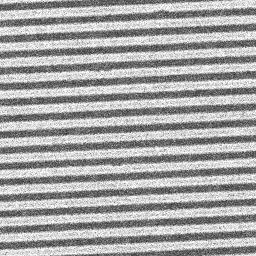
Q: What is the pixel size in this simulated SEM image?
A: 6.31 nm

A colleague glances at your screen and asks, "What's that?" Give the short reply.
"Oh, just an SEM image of parallel lines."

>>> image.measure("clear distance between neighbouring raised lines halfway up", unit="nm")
52.8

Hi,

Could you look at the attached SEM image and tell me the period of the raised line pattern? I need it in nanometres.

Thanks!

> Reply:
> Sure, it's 100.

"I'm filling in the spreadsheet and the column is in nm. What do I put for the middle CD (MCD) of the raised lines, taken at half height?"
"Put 47.3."